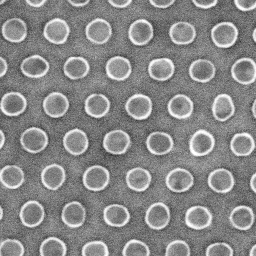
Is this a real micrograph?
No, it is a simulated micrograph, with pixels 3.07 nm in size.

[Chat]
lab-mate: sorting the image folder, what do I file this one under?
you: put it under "a regular array of raised bodies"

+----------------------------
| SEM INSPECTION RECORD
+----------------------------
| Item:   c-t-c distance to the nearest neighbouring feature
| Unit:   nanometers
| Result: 127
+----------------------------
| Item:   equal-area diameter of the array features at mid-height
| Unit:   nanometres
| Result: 72.1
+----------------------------